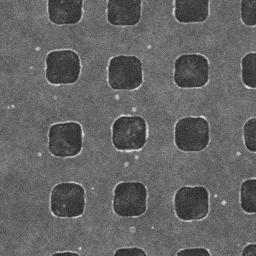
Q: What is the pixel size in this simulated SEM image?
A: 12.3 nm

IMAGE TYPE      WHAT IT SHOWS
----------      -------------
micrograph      a regular array of holes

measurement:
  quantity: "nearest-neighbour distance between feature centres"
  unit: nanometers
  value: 760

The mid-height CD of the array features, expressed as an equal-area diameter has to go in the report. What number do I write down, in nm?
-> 446